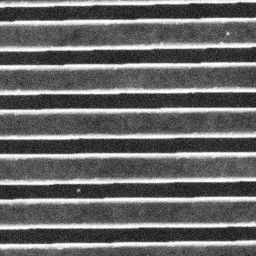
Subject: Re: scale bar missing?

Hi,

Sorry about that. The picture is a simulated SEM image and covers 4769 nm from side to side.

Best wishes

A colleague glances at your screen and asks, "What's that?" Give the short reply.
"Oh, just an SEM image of lines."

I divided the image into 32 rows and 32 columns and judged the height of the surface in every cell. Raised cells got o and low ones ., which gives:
oooooooooooo....................
................................
.......................ooooooooo
oooooooooooooooooooooooooooooooo
oooooooooooooooooooooooooooooooo
oooooooooooooooooooooooooooooooo
................................
................................
oooooooooooooooooooooooooooooooo
oooooooooooooooooooooooooooooooo
oooooooooooooooooooooooooooooooo
ooooooooooooooo.................
................................
................................
oooooooooooooooooooooooooooooooo
oooooooooooooooooooooooooooooooo
oooooooooooooooooooooooooooooooo
................................
................................
oooooooooooooooooooooooooooooooo
oooooooooooooooooooooooooooooooo
oooooooooooooooooooooooooooooooo
ooooooooooooooooooooooooooooooo.
................................
................................
oooooooooooooooooooooooooooooooo
oooooooooooooooooooooooooooooooo
oooooooooooooooooooooooooooooooo
................................
................................
.............ooooooooooooooooooo
oooooooooooooooooooooooooooooooo